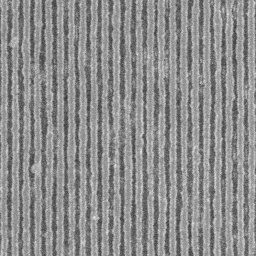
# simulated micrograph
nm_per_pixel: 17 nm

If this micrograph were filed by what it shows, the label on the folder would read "parallel lines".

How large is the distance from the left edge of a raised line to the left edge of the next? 192 nanometers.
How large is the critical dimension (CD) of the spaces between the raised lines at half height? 95.8 nanometres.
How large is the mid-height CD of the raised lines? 0.0937 µm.